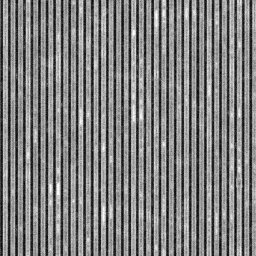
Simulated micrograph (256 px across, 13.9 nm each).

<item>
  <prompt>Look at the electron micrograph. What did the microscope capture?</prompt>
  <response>parallel lines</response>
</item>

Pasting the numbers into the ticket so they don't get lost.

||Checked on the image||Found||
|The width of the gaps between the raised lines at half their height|0.0504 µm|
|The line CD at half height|59.1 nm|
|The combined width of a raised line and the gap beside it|0.105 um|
